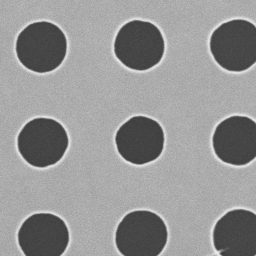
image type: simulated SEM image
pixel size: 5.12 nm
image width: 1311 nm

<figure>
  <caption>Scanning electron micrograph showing holes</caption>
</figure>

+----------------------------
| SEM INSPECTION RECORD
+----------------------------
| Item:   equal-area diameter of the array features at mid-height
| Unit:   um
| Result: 0.26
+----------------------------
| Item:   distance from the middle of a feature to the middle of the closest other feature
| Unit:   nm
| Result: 487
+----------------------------